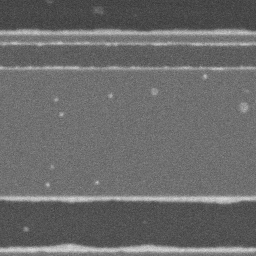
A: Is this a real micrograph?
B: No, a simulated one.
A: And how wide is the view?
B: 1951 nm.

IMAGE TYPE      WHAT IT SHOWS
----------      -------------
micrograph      lines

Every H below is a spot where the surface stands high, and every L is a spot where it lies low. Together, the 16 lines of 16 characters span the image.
LLLLLLLLLLLLLLLL
LLLLLLLLLLLLLLLL
HHHHHHHHHHHHHHHH
HHHHHHHHHHHHHHHH
HHHHHHHHHHHHHHHH
HHHHHHHHHHHHHHHH
HHHHHHHHHHHHHHHH
HHHHHHHHHHHHHHHH
HHHHHHHHHHHHHHHH
HHHHHHHHHHHHHHHH
HHHHHHHHHHHHHHHH
HHHHHHHHHHHHHHHH
LLLLLLLLLLLLLLLL
LLLLLLLLLLLLLLLL
LLLLLLLLLLLLLLLL
LLLLLLLLLLLLLLLL